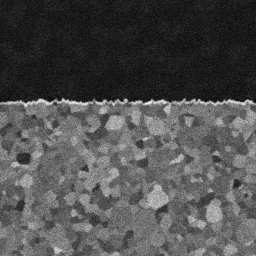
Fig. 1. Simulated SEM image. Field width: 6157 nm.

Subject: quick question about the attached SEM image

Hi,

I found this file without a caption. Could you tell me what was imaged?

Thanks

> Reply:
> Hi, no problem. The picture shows one or a few lines or trenches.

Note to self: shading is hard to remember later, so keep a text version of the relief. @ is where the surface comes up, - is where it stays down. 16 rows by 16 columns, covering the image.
----------------
----------------
----------------
----------------
----------------
----------------
@@@@@@@@@@@@@@@@
@@@@@@@@@@@@@@@@
@@@@@@@@@@@@@@@@
@@@@@@@@@@@@@@@@
@@@@@@@@@@@@@@@@
@@@@@@@@@@@@@@@@
@@@@@@@@@@@@@@@@
@@@@@@@@@@@@@@@@
@@@@@@@@@@@@@@@@
@@@@@@@@@@@@@@@@